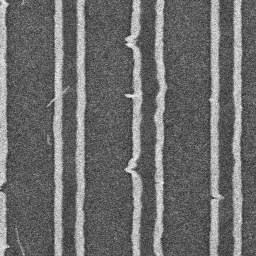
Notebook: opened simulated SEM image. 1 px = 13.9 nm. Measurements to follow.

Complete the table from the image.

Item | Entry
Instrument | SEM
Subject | one or a few lines or trenches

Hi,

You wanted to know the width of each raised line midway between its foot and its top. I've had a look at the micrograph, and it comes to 317 nanometers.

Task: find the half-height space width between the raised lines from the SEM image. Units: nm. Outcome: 768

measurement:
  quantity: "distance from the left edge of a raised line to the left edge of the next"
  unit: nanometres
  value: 1080